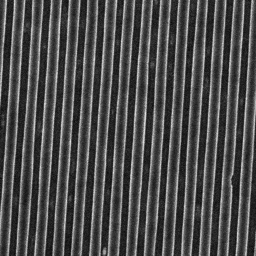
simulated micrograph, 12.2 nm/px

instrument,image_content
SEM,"parallel lines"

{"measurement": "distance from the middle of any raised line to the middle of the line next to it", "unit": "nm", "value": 223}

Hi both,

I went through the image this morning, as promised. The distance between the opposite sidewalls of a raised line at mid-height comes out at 0.123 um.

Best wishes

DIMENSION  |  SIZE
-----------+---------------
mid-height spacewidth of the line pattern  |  102 nm